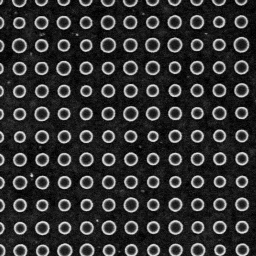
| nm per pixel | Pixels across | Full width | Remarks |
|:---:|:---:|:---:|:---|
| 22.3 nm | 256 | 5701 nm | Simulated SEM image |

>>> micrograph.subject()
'a regular array of raised bodies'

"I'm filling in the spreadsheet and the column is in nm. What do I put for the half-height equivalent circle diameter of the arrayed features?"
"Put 265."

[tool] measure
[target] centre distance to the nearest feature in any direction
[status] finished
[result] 490 nm